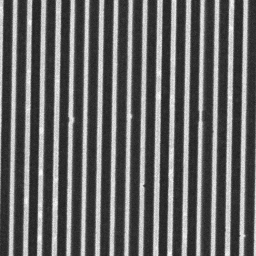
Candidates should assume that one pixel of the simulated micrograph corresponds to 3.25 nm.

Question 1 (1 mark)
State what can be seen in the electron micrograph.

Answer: parallel lines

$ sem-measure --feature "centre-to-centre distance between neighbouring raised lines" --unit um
0.0469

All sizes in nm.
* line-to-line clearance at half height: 29.2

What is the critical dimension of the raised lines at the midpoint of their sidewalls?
17.9 nanometers